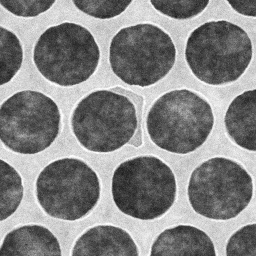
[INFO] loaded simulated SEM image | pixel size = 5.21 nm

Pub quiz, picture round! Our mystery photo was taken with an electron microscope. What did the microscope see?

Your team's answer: a regular array of holes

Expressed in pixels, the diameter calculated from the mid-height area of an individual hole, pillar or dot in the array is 64.4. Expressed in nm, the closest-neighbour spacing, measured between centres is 393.